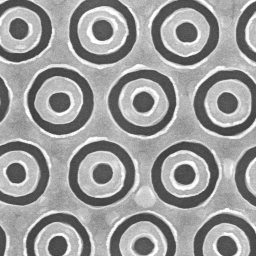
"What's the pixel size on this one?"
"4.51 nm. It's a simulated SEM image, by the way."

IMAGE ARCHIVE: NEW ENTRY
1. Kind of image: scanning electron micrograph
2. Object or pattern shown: ring-shaped grooves with a dot in the middle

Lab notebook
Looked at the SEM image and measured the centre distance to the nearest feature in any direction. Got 362 nm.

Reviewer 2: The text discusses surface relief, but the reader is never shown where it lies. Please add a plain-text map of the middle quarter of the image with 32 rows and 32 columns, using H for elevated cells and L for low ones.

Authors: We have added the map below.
HHHHHHHHHHHHHHHHHHHHHHHHHHHHHLLL
LLLHHHHHHHHHHHHHHHLLLLLHHHHHHHHH
LLLLHHHHHHHHHHHLLLLLLLLLLHHHHHHH
HLLLLHHHHHHHHHLLLLLLLLLLLLHHHHHH
HHHLLLHHHHHHHLLLLHHHHHLLLLLHHHHH
HHHHLLHHHHHHLLLLHHHHHHHHLLLHHHHH
HHHHLLLHHHHHLLLHHHHHHHHHHLLLHHHH
LHHHHLLHHHHLLLHHHHLLLLHHHLLLHHHH
LLHHHLLHHHHLLLHHHLLLLLLHHHLLHHHH
LLHHHLLHHHHLLLHHHLLLLLLHHHLLHHHH
LLHHLLLLHHHLLLHHHLLLLLHHHHLLHHHH
LHHHLLLHHHHLLLHHHHLLLLHHHHLLHHHH
HHHHLLLHHHHLLLLHHHHLHHHHHLLLHHHH
HHHLLLLHHHHHLLLLHHHHHHHHLLLHHHHH
HLLLLLHHHHHHLLLLLHHHHHHLLLLHHHHH
LLLLLHHHHHHHHLLLLLLLLLLLLLHHHHHH
LLLLHHHHHHHHHHHLLLLLLLLLLHHHHHHH
LHHHHHHHHHHHHHHHHLLLLLLHHHHHHHHH
HHHHHHHHHHHHHHHHHHHHHHHHHHHHHHHH
HHHHHHHLLLLLHHHHHHHHHHHHHHHHLLLL
HHHHHLLLLLLLLLHHHHHHHHHHHHHLLLLL
HHHHLLLLLLLLLLLHHHHHHHHHHLLLLLLL
HHHLLLHHHHHHLLLLHHHHHHHHLLLHHHHH
HHLLLHHHHHHHHLLLLHHHHHHLLLHHHHHH
HLLLLHHHHHHHHHLLLHHHHHLLLHHHHHHH
HLLLHHHHLLLLHHHLLLHHHHLLLHHHLLLL
HLLLHHHLLLLLHHHLLLHHHHLLLHHLLLLL
HLLLHHHLLLLLHHHLLLHHHHLLLHHLLLLL
HLLLHHHLLLLLHHHLLLHHHHLLLHHLLLLL
HLLLHHHHLLLHHHHLLLHHHHLLLHHHLLLL
HLLLHHHHHHHHHHHLLHHHHHLLLHHHHHLH
HHLLLHHHHHHHHHLLLHHHHHHLLLHHHHHH